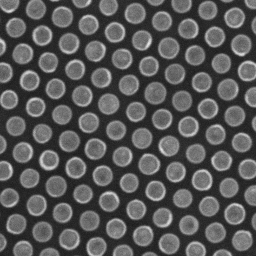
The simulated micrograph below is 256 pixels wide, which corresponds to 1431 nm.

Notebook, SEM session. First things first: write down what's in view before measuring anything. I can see a regular array of raised bodies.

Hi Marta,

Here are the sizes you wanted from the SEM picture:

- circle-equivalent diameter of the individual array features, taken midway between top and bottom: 107 nanometers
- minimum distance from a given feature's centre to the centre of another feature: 150 nanometers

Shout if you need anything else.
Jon